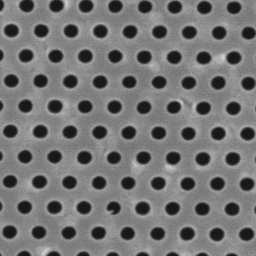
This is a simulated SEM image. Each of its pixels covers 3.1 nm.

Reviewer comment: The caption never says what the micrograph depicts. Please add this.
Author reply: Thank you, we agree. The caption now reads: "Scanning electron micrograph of a regular array of holes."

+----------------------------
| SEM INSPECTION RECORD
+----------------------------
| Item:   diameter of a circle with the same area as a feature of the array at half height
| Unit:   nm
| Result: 43.4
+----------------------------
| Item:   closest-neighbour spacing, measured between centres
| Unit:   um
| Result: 0.0899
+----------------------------